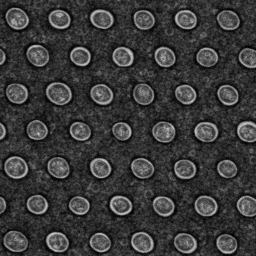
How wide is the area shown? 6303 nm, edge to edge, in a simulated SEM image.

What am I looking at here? a regular array of raised bodies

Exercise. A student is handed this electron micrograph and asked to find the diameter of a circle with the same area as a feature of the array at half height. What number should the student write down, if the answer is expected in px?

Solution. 19.6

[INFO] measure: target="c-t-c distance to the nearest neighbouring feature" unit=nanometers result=1030